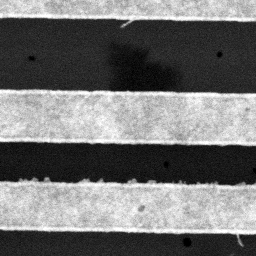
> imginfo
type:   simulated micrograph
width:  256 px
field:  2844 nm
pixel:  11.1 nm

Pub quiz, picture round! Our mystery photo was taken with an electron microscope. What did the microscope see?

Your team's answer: lines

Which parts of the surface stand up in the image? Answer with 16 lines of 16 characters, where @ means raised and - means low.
@@@@@@@@@@@@@@@@
----------------
----------------
----------------
----------------
----------------
@@@@@@@@@@@@@@@@
@@@@@@@@@@@@@@@@
@@@@@@@@@@@@@@@@
----------------
----------------
@@@@@@@@@@@-----
@@@@@@@@@@@@@@@@
@@@@@@@@@@@@@@@@
-----------@@@@@
----------------